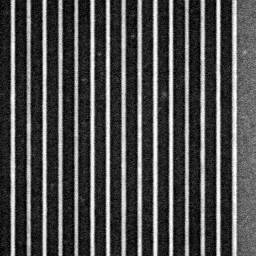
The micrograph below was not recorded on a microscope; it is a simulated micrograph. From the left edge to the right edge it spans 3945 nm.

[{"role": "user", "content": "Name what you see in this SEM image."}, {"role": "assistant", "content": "parallel lines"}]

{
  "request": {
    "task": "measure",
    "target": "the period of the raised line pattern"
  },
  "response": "244 nm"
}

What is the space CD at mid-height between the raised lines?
198 nm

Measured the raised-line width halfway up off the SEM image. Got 2.75 pixels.